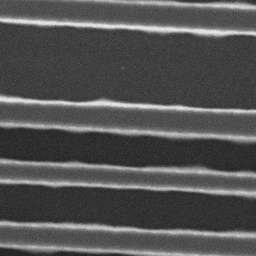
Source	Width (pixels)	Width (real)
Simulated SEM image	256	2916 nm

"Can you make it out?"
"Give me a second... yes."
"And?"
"lines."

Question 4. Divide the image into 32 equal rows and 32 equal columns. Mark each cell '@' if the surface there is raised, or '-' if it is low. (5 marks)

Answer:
@@@@@@@@@@@@@@@@@@@@@-----------
@@@@@@@@@@@@@@@@@@@@@@@@@@@@@@@@
--@@@@@@@@@@@@@@@@@@@@@@@@@@@@@@
--------------------@@@@@@@@@@@@
--------------------------------
--------------------------------
--------------------------------
--------------------------------
--------------------------------
--------------------------------
--------------------------------
--------------------------------
--------------------------------
@@@@@@@@@@@@@@@@@@@@@-----------
@@@@@@@@@@@@@@@@@@@@@@@@@@@@@@@@
@@@@@@@@@@@@@@@@@@@@@@@@@@@@@@@@
------------------@@@@@@@@@@@@@@
--------------------------------
--------------------------------
--------------------------------
@@@@@---------------------------
@@@@@@@@@@@@@@@@@@@@@@@@--------
@@@@@@@@@@@@@@@@@@@@@@@@@@@@@@@@
--------------------@@@@@@@@@@@@
--------------------------------
--------------------------------
--------------------------------
--------------------------------
@@@@@@@@@@----------------------
@@@@@@@@@@@@@@@@@@@@@@@@@@@@@@@-
@@@@@@@@@@@@@@@@@@@@@@@@@@@@@@@@
----------------@@@@@@@@@@@@@@@@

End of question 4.